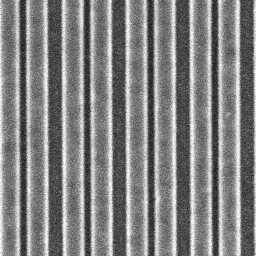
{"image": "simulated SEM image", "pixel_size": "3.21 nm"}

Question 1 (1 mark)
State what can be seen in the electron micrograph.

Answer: parallel lines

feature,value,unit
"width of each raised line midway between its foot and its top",59.7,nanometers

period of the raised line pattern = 0.103 micrometres